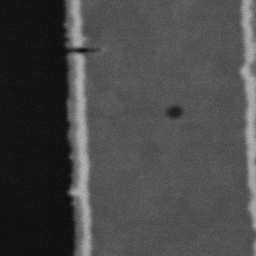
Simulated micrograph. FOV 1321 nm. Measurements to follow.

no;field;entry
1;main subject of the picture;one or a few lines or trenches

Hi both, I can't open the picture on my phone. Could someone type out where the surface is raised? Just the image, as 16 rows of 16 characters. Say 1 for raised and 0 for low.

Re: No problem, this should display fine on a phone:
0000011111111110
0000011111111110
0000011111111110
0000011111111111
0000011111111110
0000011111111111
0000011111111111
0000011111111111
0000011111111111
0000011111111111
0000011111111111
0000011111111111
0000011111111111
0000011111111111
0000011111111111
0000011111111111